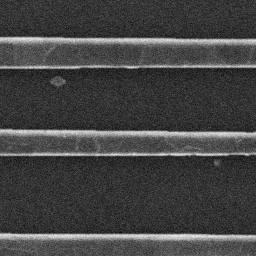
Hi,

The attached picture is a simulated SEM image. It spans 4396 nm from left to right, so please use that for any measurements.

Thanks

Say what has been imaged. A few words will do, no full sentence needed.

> lines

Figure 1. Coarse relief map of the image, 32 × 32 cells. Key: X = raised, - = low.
--------------------------------
--------------------------------
--------------------------------
--------------------------------
--------------------------------
XXXXXXXXXXXXXXXXXXXXXXXXXXXXXXXX
XXXXXXXXXXXXXXXXXXXXXXXXXXXXXXXX
XXXXXXXXXXXXXXXXXXXXXXXXXXXXXXXX
--------------------------------
--------------------------------
--------------------------------
--------------------------------
--------------------------------
--------------------------------
--------------------------------
--------------------------------
XX------------------------------
XXXXXXXXXXXXXXXXXXXXXXXXXXXXXXXX
XXXXXXXXXXXXXXXXXXXXXXXXXXXXXXXX
--------------------------------
--------------------------------
--------------------------------
--------------------------------
--------------------------------
--------------------------------
--------------------------------
--------------------------------
--------------------------------
--------------------------------
XXX-----------------------------
XXXXXXXXXXXXXXXXXXXXXXXXXXXXXXXX
XXXXXXXXXXXXXXXXXXXXXXXXXXXXXXXX